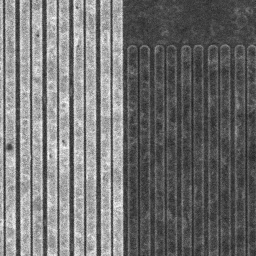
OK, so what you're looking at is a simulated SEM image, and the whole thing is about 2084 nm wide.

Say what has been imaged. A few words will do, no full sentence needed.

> parallel lines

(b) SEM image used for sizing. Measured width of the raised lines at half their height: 0.0773 microns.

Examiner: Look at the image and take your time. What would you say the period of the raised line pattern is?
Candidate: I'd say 110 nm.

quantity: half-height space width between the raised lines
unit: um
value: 0.0244